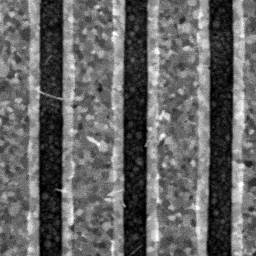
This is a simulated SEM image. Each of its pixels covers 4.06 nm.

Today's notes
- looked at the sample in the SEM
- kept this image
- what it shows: one or a few lines or trenches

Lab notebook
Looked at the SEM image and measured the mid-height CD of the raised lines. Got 216 nm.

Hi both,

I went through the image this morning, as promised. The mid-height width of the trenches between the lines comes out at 127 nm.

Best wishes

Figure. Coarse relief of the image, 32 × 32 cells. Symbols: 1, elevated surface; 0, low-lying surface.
11110000111111100001111111000011
11110000111111100001111111000011
11110000111111100001111111000011
11110000111111100001111111000011
11110000111111100001111111000011
11110000111111100001111111000011
11110000111111100001111111000011
11110000111111100001111111000011
11110000111111100001111111000011
11110000111111100001111111000011
11110000111111100001111111000011
11110000111111100001111111000011
11110000111111100001111111000011
11110000111111100001111111000011
11110000111111100001111111000011
11110000111111100001111111000011
11110000111111100001111111000011
11110000111111100001111111000011
11110000111111100001111111000011
11110000111111100001111111000011
11110000111111100001111111000011
11110000111111100001111111000011
11110000111111100001111111000011
11110000111111100001111111000011
11110000111111100001111110000011
11110000111111100001111110000111
11110000111111100001111110000111
11110000111111100001111110000111
11110000111111100001111110000111
11110000111111100001111110000111
11110000111111100001111110000111
11110000111111100001111111000111